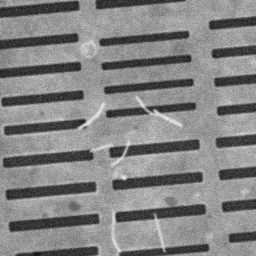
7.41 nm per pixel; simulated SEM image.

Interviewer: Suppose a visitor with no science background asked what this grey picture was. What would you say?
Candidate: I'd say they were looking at groups of lines, slits or small figures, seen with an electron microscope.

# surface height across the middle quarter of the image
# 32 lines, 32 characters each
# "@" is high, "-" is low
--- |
----@@@@@--------------@@@@@@@@@
----@@@@@@--@@@@@@@@@@@@@@@@@@@@
@@@@@@@@@@@@@@@@@@@@@@@@@@@@@@@@
@@@@@@@@@@@@@@@@@@@@@@@@@@@@@@--
@@@@@@@@@@@@@@@@@@@@@-----------
@@@@@@@@@@----------------------
@@@-@@@@@@--------------@@@@@@@@
-----@@@@@---@@@@@@@@@@@@@@@@@@@
-----@@@@@@@@@@@@@@@@@@@@@@@@@@@
@@@@@@@@@@@@@@@@@@@@@@@@@@@@@@@-
@@@@@@@@@@@@@@@@@@@@@-----------
@@@@@@@@@@@---------------------
@@@@@@@@@@------------@@@@@@@@@@
@@@@@@@@@@@---@@@@@@@@@@@@@@@@@@
-----@@@@@@@@@@@@@@@@@@@@@@@@@@@
----@@@@@@@@@@@@@@@@@@@@@@@@@@@@
--@@@@@@@@@@@@@@@@@@@@@@@@@@@@@@
@@@@@@@@@@@@@@@@@@@@@@@@@@@@@@@@
@@@@@@@@@@@@@@@@@@@@@@@@@@@@@@@@
@@@@@@@@@@@@@@@@@@@@@@@@--------
@@@@@@@@@@@@@-------------------
@@@---@@@@@---------------------
-------@@@@--------------@@@@@@@
-------@@@@@-@@@@@@@@@@@@@@@@@@@
---@@@@@@@@@@@@@@@@@@@@@@@@@@@@@
@@@@@@@@@@@@@@@@@@@@@@@@@@@@@@@@
@@@@@@@@@@@@@@@@@@@@@@@@@@@@@@@@
@@@@@@@@@@@@@@@@@@@@@@@@@@------
@@@@@@@@@@@@@@@@----------------
@@@-----@@@@--------------------
--------@@@@--------------@@@@@@
--------@@@@---@@@@@@@@@@@@@@@@@